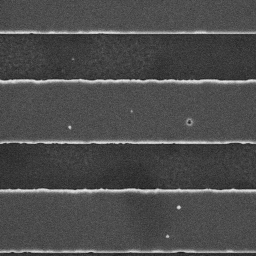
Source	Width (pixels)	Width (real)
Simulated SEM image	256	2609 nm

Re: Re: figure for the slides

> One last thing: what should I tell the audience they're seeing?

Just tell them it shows lines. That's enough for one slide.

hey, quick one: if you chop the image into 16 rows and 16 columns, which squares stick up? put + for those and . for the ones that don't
++++++++++++++++
++++++++++++++++
................
................
................
++++++++++++++++
++++++++++++++++
++++++++++++++++
++++++++++++++++
................
................
................
++++++++++++++++
++++++++++++++++
++++++++++++++++
++++++++++++++++